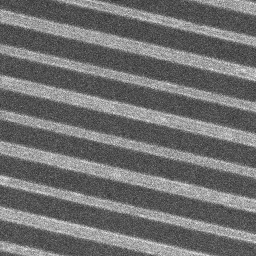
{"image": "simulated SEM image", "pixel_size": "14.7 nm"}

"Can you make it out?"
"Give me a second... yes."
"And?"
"parallel lines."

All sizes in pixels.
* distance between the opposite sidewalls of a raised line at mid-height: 24.7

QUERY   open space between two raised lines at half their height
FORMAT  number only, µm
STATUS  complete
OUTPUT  0.0859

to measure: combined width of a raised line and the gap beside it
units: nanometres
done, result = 470